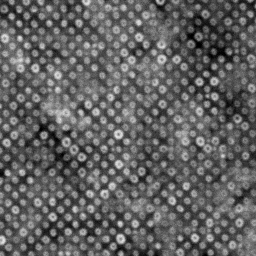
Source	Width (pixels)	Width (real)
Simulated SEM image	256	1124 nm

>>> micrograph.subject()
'a regular array of raised bodies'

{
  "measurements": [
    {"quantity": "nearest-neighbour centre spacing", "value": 45.2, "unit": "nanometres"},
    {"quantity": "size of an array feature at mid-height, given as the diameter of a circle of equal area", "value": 24.3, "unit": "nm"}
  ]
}